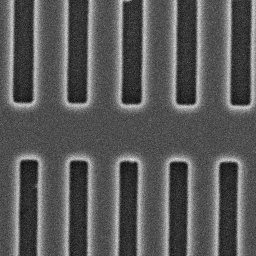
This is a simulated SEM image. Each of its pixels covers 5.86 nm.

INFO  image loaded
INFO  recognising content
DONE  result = groups of lines, slits or small figures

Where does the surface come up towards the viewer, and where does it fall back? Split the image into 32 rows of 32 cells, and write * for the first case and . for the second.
**..****...****...****...****...
**..****...****...****...****...
**..****...****...****...****...
**..****...****...****...****...
**..****...****...****...****..*
**..****...****...****...****..*
**..****...****...****...****..*
**..****...****...****...****..*
**..****...****...****...****..*
**..****...****...****...****..*
**..****...****...****...****..*
**..****...****...****...****..*
**..****...****...****...****..*
********************************
********************************
********************************
********************************
********************************
********************************
********************************
**...****..****..****..*****..**
**...****..****..****...***...**
**...****..****..****...***...**
**...****..****..****...***...**
**...****..****..****...***...**
**...****..****..****...***...**
**...****..****..****...***...**
**...****..****..****...***...**
**...***...****..****...***...**
**...***...****..****...***...**
**...***...****..****..****...**
**...***...****..****..****...**